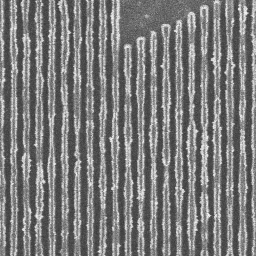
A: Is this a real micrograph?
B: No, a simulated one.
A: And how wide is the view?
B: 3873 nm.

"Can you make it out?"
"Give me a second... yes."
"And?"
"parallel lines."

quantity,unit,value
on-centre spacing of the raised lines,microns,0.192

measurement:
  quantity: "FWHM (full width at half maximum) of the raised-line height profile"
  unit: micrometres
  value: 0.102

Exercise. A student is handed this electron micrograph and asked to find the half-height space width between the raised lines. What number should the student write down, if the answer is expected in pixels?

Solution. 5.88